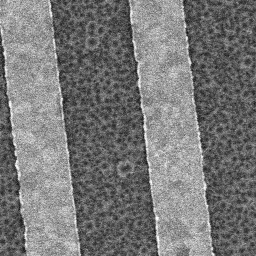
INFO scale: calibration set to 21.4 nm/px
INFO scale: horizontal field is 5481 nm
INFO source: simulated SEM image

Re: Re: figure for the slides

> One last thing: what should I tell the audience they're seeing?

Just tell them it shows one or a few lines or trenches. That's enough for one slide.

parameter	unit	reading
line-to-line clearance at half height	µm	1.7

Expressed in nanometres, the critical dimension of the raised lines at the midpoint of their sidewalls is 1110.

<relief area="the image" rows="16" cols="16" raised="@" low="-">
@@@-----@@@-----
@@@-----@@@@----
@@@-----@@@@----
@@@-----@@@@----
@@@@-----@@@----
@@@@-----@@@----
-@@@-----@@@----
-@@@-----@@@----
-@@@-----@@@----
-@@@-----@@@@---
-@@@-----@@@@---
-@@@-----@@@@---
-@@@@-----@@@---
-@@@@-----@@@---
--@@@-----@@@---
--@@@-----@@@---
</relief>